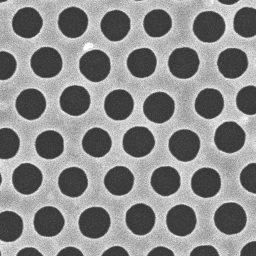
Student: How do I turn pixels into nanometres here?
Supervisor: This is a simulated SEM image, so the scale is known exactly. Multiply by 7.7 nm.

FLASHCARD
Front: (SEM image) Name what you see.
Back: a regular array of holes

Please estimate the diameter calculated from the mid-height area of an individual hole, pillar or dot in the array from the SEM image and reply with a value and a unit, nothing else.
241 nm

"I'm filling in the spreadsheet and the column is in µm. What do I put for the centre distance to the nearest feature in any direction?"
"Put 0.321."